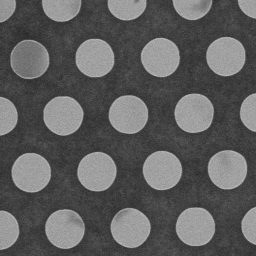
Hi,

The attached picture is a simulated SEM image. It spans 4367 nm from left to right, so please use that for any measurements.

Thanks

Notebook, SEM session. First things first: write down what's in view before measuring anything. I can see an array of small figures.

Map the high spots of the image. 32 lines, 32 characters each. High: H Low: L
HHLLLHHHHHLLLLHHHHLLLLHHHHLLLLHH
HHLLLLHHHHLLLLHHHHLLLLHHHHLLLLHH
HLLLLLLHHLLLLLLHLLLLLLLLLLLLLLLL
LLLLLLLLLLLLLLLLLLLLLLLLLLLLLLLL
LLLLLLLLLLLLLLLLLLLLLLLLLLLLLLLL
LLHHHLLLLLHHHLLLLLHHHHLLLLHHHHLL
LHHHHHLLLLHHHHLLLLHHHHLLLLHHHHHL
LHHHHHLLLLHHHHLLLLHHHHLLLLHHHHHL
LLHHHHLLLLHHHHLLLLHHHHLLLLHHHHLL
LLHHHLLLLLLHHLLLLLLHHLLLLLLLLLLL
LLLLLLLLLLLLLLLLLLLLLLLLLLLLLLLL
LLLLLLLLLLLLLLLLLLLLLLLLLLLLLLLL
HLLLLLHHHLLLLLHHHHLLLLLHHHLLLLLH
HHLLLLHHHHLLLLHHHHLLLLHHHHHLLLHH
HHLLLLHHHHLLLLHHHHLLLLHHHHHLLLHH
HHLLLLHHHHLLLLHHHHLLLLHHHHLLLLLH
HLLLLLLHHLLLLLLHHLLLLLLLHLLLLLLL
LLLLLLLLLLLLLLLLLLLLLLLLLLLLLLLL
LLLLLLLLLLLLLLLLLLLLLLLLLLLLLLLL
LLLHHLLLLLLHHHLLLLLHHHLLLLLHHHLL
LLHHHHLLLLHHHHLLLLHHHHHLLLHHHHHL
LHHHHHLLLLHHHHHLLLHHHHHLLLHHHHHL
LLHHHHLLLLHHHHLLLLHHHHLLLLHHHHLL
LLHHHLLLLLLHHLLLLLLHHLLLLLLLHLLL
LLLLLLLLLLLLLLLLLLLLLLLLLLLLLLLL
LLLLLLLLLLLLLLLLLLLLLLLLLLLLLLLL
HLLLLLLHHLLLLLLHHHLLLLLHHHLLLLLH
HHLLLLHHHHLLLLHHHHHLLLHHHHHLLLHH
HHLLLLHHHHHLLLHHHHHLLLHHHHHLLLHH
HHLLLLHHHHLLLLHHHHLLLLHHHHHLLLLH
HHLLLLLHHHLLLLLHHHLLLLLHHHLLLLLL
LLLLLLLLLLLLLLLLLLLLLLLLLLLLLLLL